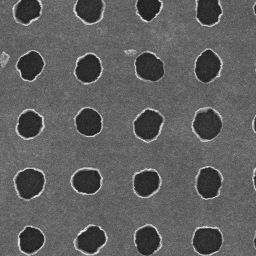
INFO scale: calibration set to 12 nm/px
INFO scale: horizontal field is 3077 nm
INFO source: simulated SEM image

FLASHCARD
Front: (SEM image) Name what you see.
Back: a regular array of holes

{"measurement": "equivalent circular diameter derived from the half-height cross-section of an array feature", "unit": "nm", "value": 330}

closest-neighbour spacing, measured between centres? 697 nanometres